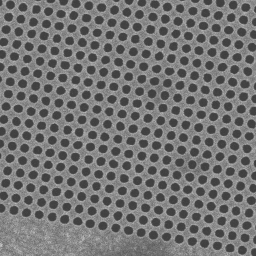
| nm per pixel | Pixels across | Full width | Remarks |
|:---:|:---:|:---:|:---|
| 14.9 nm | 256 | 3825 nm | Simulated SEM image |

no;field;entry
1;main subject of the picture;a regular array of holes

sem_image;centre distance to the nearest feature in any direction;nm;185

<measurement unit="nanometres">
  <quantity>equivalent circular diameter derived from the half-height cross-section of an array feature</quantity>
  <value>135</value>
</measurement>